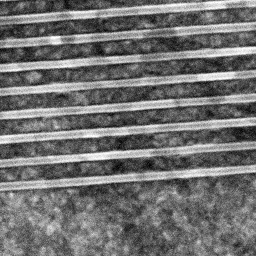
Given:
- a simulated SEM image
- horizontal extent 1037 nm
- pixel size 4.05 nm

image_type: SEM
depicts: parallel lines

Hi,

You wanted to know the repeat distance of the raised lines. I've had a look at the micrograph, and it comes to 0.0957 micrometres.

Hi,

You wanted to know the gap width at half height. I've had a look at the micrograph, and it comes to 69.6 nanometres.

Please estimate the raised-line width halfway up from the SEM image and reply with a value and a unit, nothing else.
25.7 nanometres